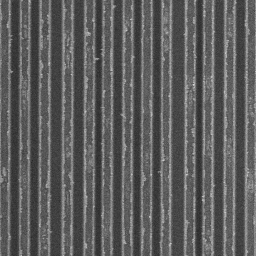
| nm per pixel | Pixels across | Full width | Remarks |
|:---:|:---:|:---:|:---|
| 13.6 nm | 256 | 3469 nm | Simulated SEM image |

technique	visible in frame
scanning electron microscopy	parallel lines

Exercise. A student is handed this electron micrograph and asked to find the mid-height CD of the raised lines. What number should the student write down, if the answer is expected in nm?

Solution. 129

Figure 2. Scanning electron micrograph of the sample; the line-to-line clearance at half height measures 141 nm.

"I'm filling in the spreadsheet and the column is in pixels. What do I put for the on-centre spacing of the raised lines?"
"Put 20.5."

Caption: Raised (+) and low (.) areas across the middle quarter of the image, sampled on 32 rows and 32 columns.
++...++...++...++...++...++...++
++...++...++...++...++...+....++
++...++...++...++..+++...++...++
++...++...++...++..+++...++...++
++...++...++...++...++...++...++
++...+++..++...++...++...+....++
++...++...++...++...++...+....++
++...++...++...++...++...+....++
++...++...++...++...++...+....++
++...++...++...++...++...+....++
++...++..+++...++...++...++...++
++...++...++...++...++...++...++
++...++...++..+++...++..+++...++
++...++...++...++...++..+++...++
++...+++..++...++..+++..+++...++
++...+++..++...++..+++...++...++
++...++...++...++...++...++...++
++...++...++...++..+++...++...++
++...++...++...++...++...++...++
++...++..+++...++...++...++...++
++...++..+++...++..+++...++...++
++...++...++...++..+++...++...++
++...++...++...++..+++...++...++
++...++...++...++...++...++...++
++...++...++...++...++...++...++
++...++...++...++..+++...++...++
++...+++..++...++..+++..+++...++
++...+++..++...++...++..+++...++
++...++...++...++...++...++...++
++...+++..++...++...++...++...++
++...+++..++...++..+++..+++...++
++...++...++...++..+++..+++...++